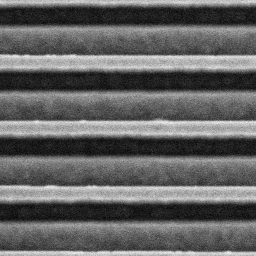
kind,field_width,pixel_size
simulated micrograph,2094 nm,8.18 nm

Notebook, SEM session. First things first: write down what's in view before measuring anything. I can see lines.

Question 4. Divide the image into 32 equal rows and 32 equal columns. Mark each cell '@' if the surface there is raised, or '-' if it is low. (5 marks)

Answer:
------------@@---------@--------
--------------------------------
--------------------------------
--------------------------------
@@@@@@@@@@@@@@@@@@@@@@@@@@@@@@@@
@@@@@@@@@@@@@@@@@@@@@@@@@@@@@@@@
@@@@@@@@@@@@@@@@@@@@@@@@@@@@@@@@
@@@@@@@@@@@@@@@@@@@@@@@@@@@@@@@@
---@---@-----@@@@@@@@--@--@@@@@@
--------------------------------
--------------------------------
--------------------------------
@@@@@@@@@@@@@@@@@@@@@@@@@@@@@@@@
@@@@@@@@@@@@@@@@@@@@@@@@@@@@@@@@
@@@@@@@@@@@@@@@@@@@@@@@@@@@@@@@@
@@@@@@@@@@@@@@@@@@@@@@@@@@@@@@@@
@@@@@@@@@@@@@@@@@@@@@@@@@@@@@@@@
--------------------------------
--------------------------------
--------------------------------
@@@@@@@@@@@@@@@@@@@@@@@@@@@@@@@@
@@@@@@@@@@@@@@@@@@@@@@@@@@@@@@@@
@@@@@@@@@@@@@@@@@@@@@@@@@@@@@@@@
@@@@@@@@@@@@@@@@@@@@@@@@@@@@@@@@
@@@@@@@@@@@@@@@@@@@@@@@@@@@@@@@@
--------------------------------
--------------------------------
--------------------------------
@@@@@@@@@@@@@@@@@@@@@@@@@@@@@@@@
@@@@@@@@@@@@@@@@@@@@@@@@@@@@@@@@
@@@@@@@@@@@@@@@@@@@@@@@@@@@@@@@@
@@@@@@@@@@@@@@@@@@@@@@@@@@@@@@@@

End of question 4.